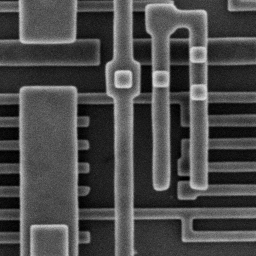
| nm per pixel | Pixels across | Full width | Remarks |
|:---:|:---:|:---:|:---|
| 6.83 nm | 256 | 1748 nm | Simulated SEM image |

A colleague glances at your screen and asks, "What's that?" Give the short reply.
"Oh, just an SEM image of wiring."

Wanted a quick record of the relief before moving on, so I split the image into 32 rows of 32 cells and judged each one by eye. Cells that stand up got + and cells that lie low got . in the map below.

..++++++++....++................
..++++++++....++..++++++++......
..++++++++....+++.++++++++......
..++++++++....+++.++++++++......
..+++++++.....++...++...++......
..............+++..++...++......
..............+++..++...++......
..............+++..++...++......
.............+++++.++...++......
.............+++++.++...++......
.............+++++.++...++......
..++++++++...+++++.++...++......
..++++++++....+++..++...++......
..++++++++....+++..++...++......
..++++++++....+++..++...++......
..++++++++....+++..++...++......
..++++++++....+++..++...++......
..++++++++....+++..++...++......
..++++++++....+++..++...++......
...+++++++....+++..++...++......
...+++++++....+++..++...++......
...+++++++....+++..++...++......
...+++++++....+++..++...++......
...+++++++....+++..++...++......
...+++++++....+++...............
...+++++++....+++...............
...+++++++....+++...............
...+++++++....+++...............
...+++++++....+++...............
...+++++++....+++...............
...+++++++....+++...............
...+++++++....+++...............